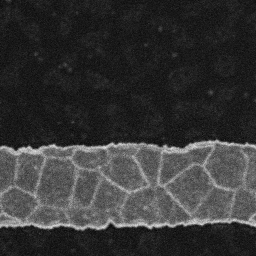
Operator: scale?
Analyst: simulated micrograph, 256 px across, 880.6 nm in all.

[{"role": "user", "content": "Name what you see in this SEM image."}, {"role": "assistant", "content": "one or a few lines or trenches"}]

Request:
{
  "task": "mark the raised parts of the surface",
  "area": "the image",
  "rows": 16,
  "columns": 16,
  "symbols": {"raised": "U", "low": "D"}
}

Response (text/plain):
DDDDDDDDDDDDDDDD
DDDDDDDDDDDDDDDD
DDDDDDDDDDDDDDDD
DDDDDDDDDDDDDDDD
DDDDDDDDDDDDDDDD
DDDDDDDDDDDDDDDD
DDDDDDDDDDDDDDDD
DDDDDDDDDDDDDDDD
DDDDDDDDDDDDDDDD
UDDUUUUUUUUUUUUU
UUUUUUUUUUUUUUUU
UUUUUUUUUUUUUUUU
UUUUUUUUUUUUUUUU
UUUUUUUUUUUUUUUU
DDDDDDDDDDDDDDDD
DDDDDDDDDDDDDDDD